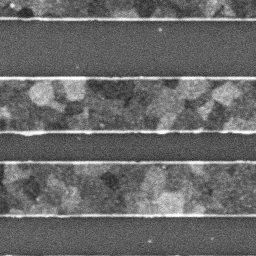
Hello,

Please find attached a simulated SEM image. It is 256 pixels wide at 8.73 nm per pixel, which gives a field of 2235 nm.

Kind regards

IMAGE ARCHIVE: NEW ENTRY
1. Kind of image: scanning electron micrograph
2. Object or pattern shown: lines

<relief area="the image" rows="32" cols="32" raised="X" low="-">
XXXXXXXXXXXXXXXXXXXXXXXXXXXXXXXX
XXXXXXXXXXXXXXXXXXXXXXXXXXXXXXXX
--------------------------------
--------------------------------
--------------------------------
--------------------------------
--------------------------------
--------------------------------
--------------------------------
--------------------------------
XXXXXXXXXXXXXXXXXXXXXXXXXXXXXXXX
XXXXXXXXXXXXXXXXXXXXXXXXXXXXXXXX
XXXXXXXXXXXXXXXXXXXXXXXXXXXXXXXX
XXXXXXXXXXXXXXXXXXXXXXXXXXXXXXXX
XXXXXXXXXXXXXXXXXXXXXXXXXXXXXXXX
XXXXXXXXXXXXXXXXXXXXXXXXXXXXXXXX
XXXXXXXX------X---XX---------XXX
--------------------------------
--------------------------------
--------------------------------
XXXXXXXXXXXXXXXXXXXXXXXXXXXXXXXX
XXXXXXXXXXXXXXXXXXXXXXXXXXXXXXXX
XXXXXXXXXXXXXXXXXXXXXXXXXXXXXXXX
XXXXXXXXXXXXXXXXXXXXXXXXXXXXXXXX
XXXXXXXXXXXXXXXXXXXXXXXXXXXXXXXX
XXXXXXXXXXXXXXXXXXXXXXXXXXXXXXXX
XXXXXXXXXXXXXXXXXXXXXXXXXXXXXXXX
--------------------------------
--------------------------------
--------------------------------
--------------------------------
--------------------------------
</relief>